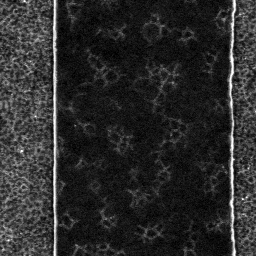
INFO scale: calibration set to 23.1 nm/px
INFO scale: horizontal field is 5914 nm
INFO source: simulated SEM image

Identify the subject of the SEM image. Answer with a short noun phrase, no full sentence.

one or a few lines or trenches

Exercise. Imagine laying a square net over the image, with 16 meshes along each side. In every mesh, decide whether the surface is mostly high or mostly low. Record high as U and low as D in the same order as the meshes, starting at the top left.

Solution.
DDDUUUUUUUUUUUUD
DDDUUUUUUUUUUUUD
DDDUUUUUUUUUUUUD
DDDUUUUUUUUUUUUD
DDDUUUUUUUUUUUUD
DDDUUUUUUUUUUUDD
DDDUUUUUUUUUUUUD
DDDUUUUUUUUUUUUD
DDDUUUUUUUUUUUUD
DDDUUUUUUUUUUUUD
DDDUUUUUUUUUUUUD
DDDUUUUUUUUUUUUD
DDDUUUUUUUUUUUUD
DDDUUUUUUUUUUUUD
DDDUUUUUUUUUUUUD
DDDUUUUUUUUUUUUD